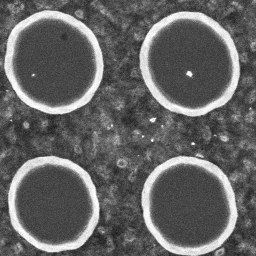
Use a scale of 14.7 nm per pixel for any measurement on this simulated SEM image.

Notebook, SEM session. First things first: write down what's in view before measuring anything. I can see raised bodies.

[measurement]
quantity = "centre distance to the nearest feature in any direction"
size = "1990 nm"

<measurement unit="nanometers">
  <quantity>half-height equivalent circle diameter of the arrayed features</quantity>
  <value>1360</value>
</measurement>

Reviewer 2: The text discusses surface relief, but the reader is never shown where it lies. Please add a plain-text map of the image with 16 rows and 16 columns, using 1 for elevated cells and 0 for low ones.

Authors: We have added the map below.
0000000000000000
0011100000111000
0111110001111100
0111110001111110
0111110001111110
0111110000111100
0011100000111100
0000000000000000
0000000000000000
0000000000000000
0011100000111000
0111110001111100
0111110001111100
0111110001111110
0111100000111100
0000000000011000